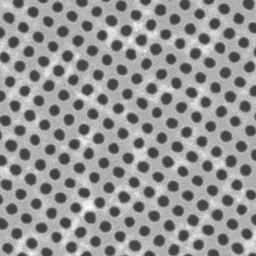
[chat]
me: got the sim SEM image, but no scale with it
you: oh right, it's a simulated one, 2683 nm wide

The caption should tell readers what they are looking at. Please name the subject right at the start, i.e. a regular array of holes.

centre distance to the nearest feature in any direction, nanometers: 181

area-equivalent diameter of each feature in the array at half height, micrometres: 0.125